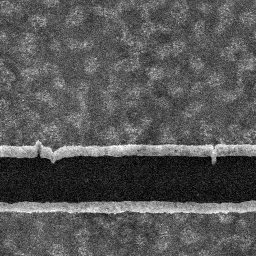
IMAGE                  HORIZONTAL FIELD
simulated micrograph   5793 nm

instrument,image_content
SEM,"one or a few lines or trenches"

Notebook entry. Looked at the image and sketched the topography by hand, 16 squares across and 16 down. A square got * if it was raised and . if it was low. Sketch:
****************
****************
****************
****************
****************
****************
****************
****************
****************
...*.........*..
................
................
................
****************
****************
****************